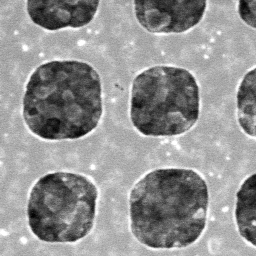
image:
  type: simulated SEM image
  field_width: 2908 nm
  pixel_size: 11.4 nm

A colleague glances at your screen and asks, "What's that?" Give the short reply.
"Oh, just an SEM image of holes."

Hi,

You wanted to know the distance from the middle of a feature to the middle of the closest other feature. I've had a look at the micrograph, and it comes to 1180 nanometers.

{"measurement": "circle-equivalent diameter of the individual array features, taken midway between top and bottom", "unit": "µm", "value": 0.78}